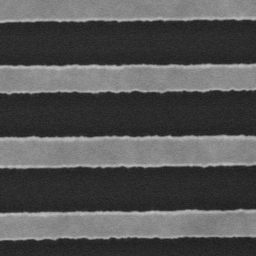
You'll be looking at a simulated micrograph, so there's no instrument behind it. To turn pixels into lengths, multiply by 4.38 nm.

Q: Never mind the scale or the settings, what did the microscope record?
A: lines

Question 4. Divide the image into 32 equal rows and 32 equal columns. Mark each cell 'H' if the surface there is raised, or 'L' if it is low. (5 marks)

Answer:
HHHHHHHHHHHHHHHHHHHHHHHHHHHHHHHH
HHHHHHHHHHHHHHHHHHHHHHHHHHHHHHHH
HHHHHHHHHHHLLHHHHLHLHLLHLLLLLLLL
LLLLLLLLLLLLLLLLLLLLLLLLLLLLLLLL
LLLLLLLLLLLLLLLLLLLLLLLLLLLLLLLL
LLLLLLLLLLLLLLLLLLLLLLLLLLLLLLLL
LLLLLLLLLLLLLLLLLLLLLLLLLLLLLLLL
LLLLLLLLLLLLLLLLLLLLLLLLLLLLLLLL
HHHHHHHHHHHHHHHHHHHHHHHHHHHHHHHH
HHHHHHHHHHHHHHHHHHHHHHHHHHHHHHHH
HHHHHHHHHHHHHHHHHHHHHHHHHHHHHHHH
HHHHHHHLHHHHHLHHLLHHHLLLLHLLLLLL
LLLLLLLLLLLLLLLLLLLLLLLLLLLLLLLL
LLLLLLLLLLLLLLLLLLLLLLLLLLLLLLLL
LLLLLLLLLLLLLLLLLLLLLLLLLLLLLLLL
LLLLLLLLLLLLLLLLLLLLLLLLLLLLLLLL
LLLLLLLLLLLLLLLLLLLLLLLLLLLLLLLL
HHHHHHHHHHHHHHHHHHHHHHHHHHHHHHHH
HHHHHHHHHHHHHHHHHHHHHHHHHHHHHHHH
HHHHHHHHHHHHHHHHHHHHHHHHHHHHHHHH
HHHHHHHHHHHHHHHHHHHHHHHHHHHHHHHH
LLLLLLLLLLLLLLLLLLLLLLLLLLLLLLLL
LLLLLLLLLLLLLLLLLLLLLLLLLLLLLLLL
LLLLLLLLLLLLLLLLLLLLLLLLLLLLLLLL
LLLLLLLLLLLLLLLLLLLLLLLLLLLLLLLL
LLLLLLLLLLLLLLLLLLLLLLLLLLLLLLLL
LLLLLLLLLLLLHHHLHHHHHHHHHHHHHHHH
HHHHHHHHHHHHHHHHHHHHHHHHHHHHHHHH
HHHHHHHHHHHHHHHHHHHHHHHHHHHHHHHH
HHHHHHHHHHHHHHHHHHHHHHHHHHHHHHHH
LLLLLLLLLLLLLLLLLLLLLLLLLLLLLLLL
LLLLLLLLLLLLLLLLLLLLLLLLLLLLLLLL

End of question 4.